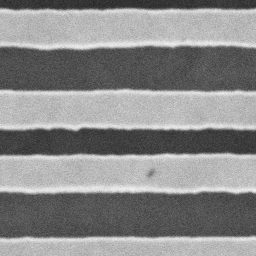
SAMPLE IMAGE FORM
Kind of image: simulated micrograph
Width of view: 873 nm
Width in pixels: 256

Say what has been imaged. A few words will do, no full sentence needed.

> lines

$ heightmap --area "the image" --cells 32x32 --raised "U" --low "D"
DDDDDDDDDDDDDDDDDDDDDDDDDDDDDDDD
UUUUUUUUUUUUUUUUUUUUUUUUUUUUUUUU
UUUUUUUUUUUUUUUUUUUUUUUUUUUUUUUU
UUUUUUUUUUUUUUUUUUUUUUUUUUUUUUUU
UUUUUUUUUUUUUUUUUUUUUUUUUUUUUUUU
UUUUUUUUUUUUUUUUUUUUUUUUUUUUUUUU
DDDDDDDDDDDDDDDDDDDDDDDDDDDDDDDD
DDDDDDDDDDDDDDDDDDDDDDDDDDDDDDDD
DDDDDDDDDDDDDDDDDDDDDDDDDDDDDDDD
DDDDDDDDDDDDDDDDDDDDDDDDDDDDDDDD
DDDDDDDDDDDDDDDDDDDDDDDDDDDDDDDD
UUUUUUUUUUUUUUUUUUUUUUUUUUUUUUUU
UUUUUUUUUUUUUUUUUUUUUUUUUUUUUUUU
UUUUUUUUUUUUUUUUUUUUUUUUUUUUUUUU
UUUUUUUUUUUUUUUUUUUUUUUUUUUUUUUU
UUUUUUUUUUUUUUUUUUUUUUUUUUUUUUUU
DDDDDDDDDDDDDDDDDDDDDDDDDDDDDDDD
DDDDDDDDDDDDDDDDDDDDDDDDDDDDDDDD
DDDDDDDDDDDDDDDDDDDDDDDDDDDDDDDD
DDDDUUDDDUUUUUUUUUUUUUUUUUUUUUUU
UUUUUUUUUUUUUUUUUUUUUUUUUUUUUUUU
UUUUUUUUUUUUUUUUUUUUUUUUUUUUUUUU
UUUUUUUUUUUUUUUUUUUUUUUUUUUUUUUU
UUUUUUUUUUUUUUUUUUUUUUUUUUUUUUUU
DDDDDDDDDDDDDDDDDDDDDDDDDDDDDDDD
DDDDDDDDDDDDDDDDDDDDDDDDDDDDDDDD
DDDDDDDDDDDDDDDDDDDDDDDDDDDDDDDD
DDDDDDDDDDDDDDDDDDDDDDDDDDDDDDDD
DDDDDDDDDDDDDDDDDDDDDDDDDDDDDDDD
DDDDDDDDDDDDDDDDDDDDDDDDDDDDDDDD
UUUUUUUUUUUUUUUUUUUUUUUUUUUUUUUU
UUUUUUUUUUUUUUUUUUUUUUUUUUUUUUUU